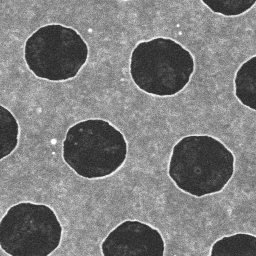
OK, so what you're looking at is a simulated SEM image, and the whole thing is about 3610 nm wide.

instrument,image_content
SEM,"holes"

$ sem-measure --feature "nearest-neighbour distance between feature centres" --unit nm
1470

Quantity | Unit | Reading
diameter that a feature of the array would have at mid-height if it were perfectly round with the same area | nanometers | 855